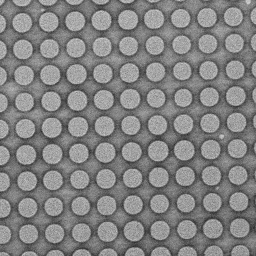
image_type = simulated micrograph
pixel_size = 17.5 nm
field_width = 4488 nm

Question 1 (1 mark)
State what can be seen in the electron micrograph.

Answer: an array of small figures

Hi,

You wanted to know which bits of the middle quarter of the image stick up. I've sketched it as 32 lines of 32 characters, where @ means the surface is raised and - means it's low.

--@@----@@@----@@@---@@@@---@@@-
-@@@@---@@@@--@@@@@--@@@@---@@@@
-@@@@---@@@@--@@@@@--@@@@---@@@@
-@@@@---@@@@--@@@@---@@@@---@@@-
--@@@----@@---------------------
--------------------------------
----------------@------------@@-
--@@@---@@@@--@@@@@--@@@@---@@@@
-@@@@@--@@@@--@@@@@--@@@@---@@@@
-@@@@@--@@@@--@@@@@--@@@@---@@@@
-@@@@---@@@@---@@@----@@-----@--
---@----------------------------
--------------------------------
---@-----@@-----@@----@@@---@@@@
-@@@@@--@@@@---@@@@--@@@@@--@@@@
-@@@@@--@@@@--@@@@@--@@@@@--@@@@
-@@@@@--@@@@---@@@@--@@@@---@@@@
--@@@----@@-----@---------------
--------------------------------
-----------------------@-----@@-
--@@@----@@@---@@@@--@@@@@--@@@@
--@@@@--@@@@@--@@@@--@@@@@--@@@@
-@@@@@--@@@@@--@@@@--@@@@@--@@@@
--@@@@--@@@@---@@@@---@@@----@@@
---@------@---------------------
--------------------------------
----------@-----@@----@@@----@@@
--@@@@---@@@---@@@@--@@@@@--@@@@
--@@@@--@@@@@--@@@@--@@@@@--@@@@
--@@@@--@@@@@--@@@@---@@@@--@@@@
--@@@@---@@@----@@-----@@-------
--------------------------------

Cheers